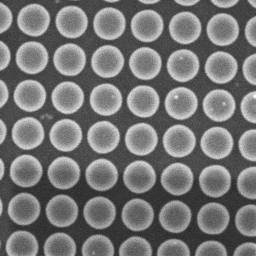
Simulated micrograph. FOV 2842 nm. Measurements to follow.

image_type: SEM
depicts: an array of small figures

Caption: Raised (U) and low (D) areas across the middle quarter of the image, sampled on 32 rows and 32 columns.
UUUUUDDUUUUUUUUDDUUUUUUUDDUUUUUU
UUUUDDDUUUUUUUDDDUUUUUUUDDUUUUUU
UUUDDDDDDUUUUDDDDDUUUUUDDDUUUUUU
DDDDDDDDDDDDDDDDDDDUUUDDDDDUUUUU
DDDDDDDDDDDDDDDDDDDDDDDDDDDDDDDD
UUUUDDDDDUUUDDDDDDDDDDDDDDDDDDDD
UUUUDDDUUUUUUUDDDUUUUUUDDDDUUUUD
UUUUUDDUUUUUUUDDUUUUUUUDDDUUUUUU
UUUUUDDUUUUUUUDDUUUUUUUUDDUUUUUU
UUUUUDDUUUUUUUDDUUUUUUUUDUUUUUUU
UUUUDDDUUUUUUUDDUUUUUUUDDUUUUUUU
UUUDDDDDUUUUUDDDDUUUUUUDDDUUUUUU
DDDDDDDDDUUUDDDDDDUUUUDDDDUUUUUU
DDDDDDDDDDDDDDDDDDDDDDDDDDDDUUUD
UUUDDDDDDUUDDDDDDDDDDDDDDDDDDDDD
UUUUDDDUUUUUUDDDDUUUUUDDDDDDUUDD
UUUUDDUUUUUUUDDDUUUUUUDDDDUUUUUD
UUUUDDUUUUUUUUDDUUUUUUUDDUUUUUUU
UUUUDDUUUUUUUUDUUUUUUUUDDUUUUUUU
UUUUDDUUUUUUUUDUUUUUUUUDDUUUUUUU
UUUDDDDUUUUUUDDDUUUUUUUDDUUUUUUU
UUDDDDDDUUUUDDDDUUUUUUDDDUUUUUUU
DDDDDDDDDDDDDDDDDDUUUDDDDDUUUUUD
UDDDDDDDDDDDDDDDDDDDDDDDDDDDDDDD
UUUDDDDUUUUUDDDDDDUUDDDDDDDDDDDD
UUUDDDUUUUUUDDDDUUUUUUDDDDUUUUDD
UUUUDDUUUUUUUDDUUUUUUUDDDUUUUUUD
UUUUDUUUUUUUUDDUUUUUUUUDDUUUUUUU
UUUUDDUUUUUUUDDUUUUUUUUDUUUUUUUU
UUUDDDUUUUUUUDDUUUUUUUUDUUUUUUUU
UUDDDDDUUUUUDDDDUUUUUUDDDUUUUUUU
DDDDDDDDUUDDDDDDDUUUUDDDDDUUUUUD